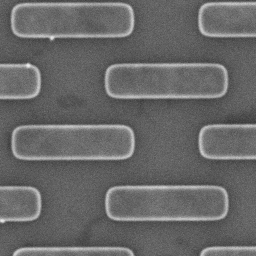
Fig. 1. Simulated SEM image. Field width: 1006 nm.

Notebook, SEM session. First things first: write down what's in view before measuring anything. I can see groups of lines, slits or small figures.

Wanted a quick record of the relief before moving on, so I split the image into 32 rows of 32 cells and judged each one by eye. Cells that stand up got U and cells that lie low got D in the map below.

DDDUUUUUUUUUUUUUDDDDDDDDDDUUUUUU
DDUUUUUUUUUUUUUUUDDDDDDDDUUUUUUU
DUUUUUUUUUUUUUUUUDDDDDDDDUUUUUUU
DDUUUUUUUUUUUUUUUDDDDDDDDUUUUUUU
DDDUUUUUUUUUUUUDDDDDDDDDDDDDDDDD
DDDDDDDDDDDDDDDDDDDDDDDDDDDDDDDD
DDDDDDDDDDDDDDDDDDDDDDDDDDDDDDDD
DDDDDDDDDDDDDDDDDDDDDDDDDDDDDDDD
UUUUUDDDDDDDDDUUUUUUUUUUUUUUDDDD
UUUUUDDDDDDDDUUUUUUUUUUUUUUUDDDD
UUUUUDDDDDDDDUUUUUUUUUUUUUUUDDDD
UUUUUDDDDDDDDUUUUUUUUUUUUUUUDDDD
DDDDDDDDDDDDDDDDDDDDDDDDDDDDDDDD
DDDDDDDDDDDDDDDDDDDDDDDDDDDDDDDD
DDDDDDDDDDDDDDDDDDDDDDDDDDDDDDDD
DDDDDDDDDDDDDDDDDDDDDDDDDDDDDDDD
DDUUUUUUUUUUUUUUUDDDDDDDDUUUUUUU
DDUUUUUUUUUUUUUUUDDDDDDDDUUUUUUU
DDUUUUUUUUUUUUUUUDDDDDDDDUUUUUUU
DDUUUUUUUUUUUUUUDDDDDDDDDDUUUUUU
DDDDDDDDDDDDDDDDDDDDDDDDDDDDDDDD
DDDDDDDDDDDDDDDDDDDDDDDDDDDDDDDD
DDDDDDDDDDDDDDDDDDDDDDDDDDDDDDDD
UUUUDDDDDDDDDDUUUUUUUUUUUUUUDDDD
UUUUUDDDDDDDDUUUUUUUUUUUUUUUDDDD
UUUUUDDDDDDDDUUUUUUUUUUUUUUUDDDD
UUUUUDDDDDDDDUUUUUUUUUUUUUUUDDDD
UUUDDDDDDDDDDDDDDDDDDDDDDDDDDDDD
DDDDDDDDDDDDDDDDDDDDDDDDDDDDDDDD
DDDDDDDDDDDDDDDDDDDDDDDDDDDDDDDD
DDDDDDDDDDDDDDDDDDDDDDDDDDDDDDDD
DDUUUUUUUUUUUUUUDDDDDDDDDUUUUUUU